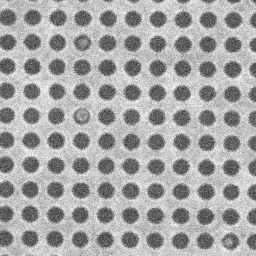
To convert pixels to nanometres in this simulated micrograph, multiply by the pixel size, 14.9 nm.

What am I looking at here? a regular array of holes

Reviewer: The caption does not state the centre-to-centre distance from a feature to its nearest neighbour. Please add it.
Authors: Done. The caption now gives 364 nm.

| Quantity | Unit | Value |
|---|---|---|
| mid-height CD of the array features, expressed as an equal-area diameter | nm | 280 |